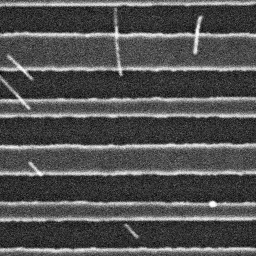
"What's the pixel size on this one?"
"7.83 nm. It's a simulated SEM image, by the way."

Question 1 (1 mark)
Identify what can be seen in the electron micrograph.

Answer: lines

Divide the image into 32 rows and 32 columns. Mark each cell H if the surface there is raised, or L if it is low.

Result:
HHHHHHHHHHHHHHHHHHHHHHHHHHHHHHHH
LLLLLLLLLLLLLLLLLLLLLLLLLLLLLLLL
LLLLLLLLLLLLLLLLLLLLLLLLLLLLLLLL
LLLLLLLLLLLLLLLLLLLLLLLLLLLLLLLL
HHHHHHHHHHHHHHHHHHHHHHHHHHHHHHHH
HHHHHHHHHHHHHHHHHHHHHHHHHHHHHHHH
HHHHHHHHHHHHHHHHHHHHHHHHHHHHHHHH
HHHHHHHHHHHHHHHHHHHHHHHHHHHHHHHH
HHHHHHHHHHHHHHHHHHHHHHHHHHHHHHHH
LLLLLLLLLLLLLLLLLLLLLLLLLLLLLLLL
LLLLLLLLLLLLLLLLLLLLLLLLLLLLLLLL
LLLLLLLLLLLLLLLLLLLLLLLLLLLLLLLL
HHHHHHHHHHHHHHHHHHHHHHHHHHHHHHHH
HHHHHHHHHHHHHHHHHHHHHHHHHHHHHHHH
HHHLHLHHLHHLLLHLLLLHHLLLHHLHHHHH
LLLLLLLLLLLLLLLLLLLLLLLLLLLLLLLL
LLLLLLLLLLLLLLLLLLLLLLLLLLLLLLLL
LLLLLLLLLLLLLLLLLLLLLLLLLLLLLLLL
HHHHHHHHHHHHHHHHHHHHHHHHHHHHHHHH
HHHHHHHHHHHHHHHHHHHHHHHHHHHHHHHH
HHHHHHHHHHHHHHHHHHHHHHHHHHHHHHHH
HHHHHHHHHHHHHHHHHHHHHHHHHHHHHHHH
LLLLLLLLLLLLLLLLLLLLLLLLLLLLLLLL
LLLLLLLLLLLLLLLLLLLLLLLLLLLLLLLL
LLLLLLLLLLLLLLLLLLLLLLLLLLLLLLLL
HHHHHHHHHHHHHHHHHHHHHHHHHHHHHHHH
HHHHHHHHHHHHHHHHHHHHHHHHHHHHHHHH
HHHHHHLLLLLHHHLLLLLLLLLLLLLLLLLL
LLLLLLLLLLLLLLLLLLLLLLLLLLLLLLLL
LLLLLLLLLLLLLLLLLLLLLLLLLLLLLLLL
LLLLLLLLLLLLLLLLLLLLLLLLLLLLLLLL
HHHHHHHHHHHHHHHHHHHHHHHHHHHHHHHH